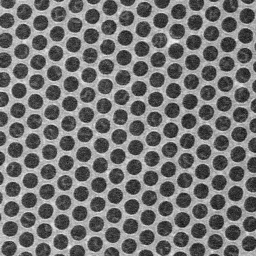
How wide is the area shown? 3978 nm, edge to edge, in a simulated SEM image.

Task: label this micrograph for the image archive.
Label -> a regular array of holes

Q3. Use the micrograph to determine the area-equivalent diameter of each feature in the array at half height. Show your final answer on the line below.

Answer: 0.253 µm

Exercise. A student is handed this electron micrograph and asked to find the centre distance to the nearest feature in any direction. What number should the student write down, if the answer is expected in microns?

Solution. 0.304